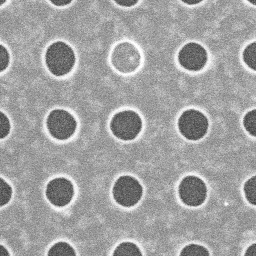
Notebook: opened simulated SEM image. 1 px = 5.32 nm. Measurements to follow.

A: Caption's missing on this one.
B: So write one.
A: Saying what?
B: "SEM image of a regular array of holes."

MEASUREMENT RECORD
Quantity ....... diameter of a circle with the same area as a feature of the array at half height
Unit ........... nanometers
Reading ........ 166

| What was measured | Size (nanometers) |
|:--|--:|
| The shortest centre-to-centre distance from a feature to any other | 350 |